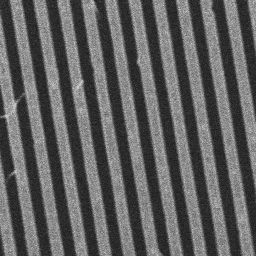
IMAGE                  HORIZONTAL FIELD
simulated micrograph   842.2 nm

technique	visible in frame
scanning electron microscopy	parallel lines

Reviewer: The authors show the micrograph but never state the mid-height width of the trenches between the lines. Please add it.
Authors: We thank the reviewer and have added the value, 40.9 nm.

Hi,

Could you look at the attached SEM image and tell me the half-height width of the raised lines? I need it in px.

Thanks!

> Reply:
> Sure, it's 10.6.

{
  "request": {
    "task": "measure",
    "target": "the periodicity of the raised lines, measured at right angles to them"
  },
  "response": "77.1 nanometres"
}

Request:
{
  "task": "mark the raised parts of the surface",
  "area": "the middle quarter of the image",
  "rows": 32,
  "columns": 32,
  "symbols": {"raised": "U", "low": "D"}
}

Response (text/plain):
DUUUDDDUUUDDDUUUDDDUUUDDDUUUDDDU
DDUUDDDDUUDDDUUUDDDUUUDDDUUUDDDU
DDUUDDDDUUDDDDUUDDDUUUDDDUUUDDDU
DDUUDDDDUUDDDDUUDDDDUUDDDUUUDDDU
DDUUUDDDUUUDDDUUDDDDUUDDDDUUDDDD
DDUUUDDDUUUDDDUUUDDDUUUDDDUUDDDD
DDUUUDDDUUUDDDUUUDDDUUUDDDUUUDDD
DDUUUDDDUUUDDDUUUDDDUUUDDDUUUDDD
DDUUUDDDUUUDDDDUUDDDUUUDDDUUUDDD
DDDUUDDDDUUDDDDUUDDDDUUDDDUUUDDD
DDDUUUDDDUUDDDDUUDDDDUUDDDDUUDDD
DDDUUUDDDUUUDDDUUUDDDUUUDDDUUDDD
DDDUUUDDDUUUDDDUUUDDDUUUDDDUUUDD
DDDUUUDDDUUUDDDUUUDDDUUUDDDUUUDD
DDDUUUDDDUUUDDDUUUDDDUUUDDDUUUDD
DDDDUUDDDDUUDDDDUUDDDDUUDDDDUUDD
UDDDUUUDDDUUUDDDUUDDDDUUDDDDUUDD
UDDDUUUDDDUUUDDDUUUDDDUUUDDDUUDD
UDDDUUUDDDUUUDDDUUUDDDUUUDDDUUUD
UDDDDUUDDDUUUDDDUUUDDDUUUDDDUUUD
UDDDDUUDDDUUUDDDUUUDDDUUUDDDUUUD
UUDDDUUDDDDUUDDDUUUDDDDUUDDDDUUD
UDDDDUUUDDDUUUDDDUUDDDDUUDDDDUUD
UUDDDUUUDDDUUUDDDUUUDDDUUDDDDUUD
UUDDDUUUDDDUUUDDDUUUDDDUUUDDDUUU
UUDDDUUUDDDUUUDDDUUUDDDUUUDDDUUU
UUDDDUUUDDDUUUDDDUUUDDDUUUDDDUUU
UUUDDDUUDDDDUUDDDUUUDDDDUUDDDUUU
UUUDDDUUUDDDUUDDDDUUDDDDUUDDDUUU
UUUDDDUUUDDDUUUDDDUUUDDDUUUDDDUU
UUUDDDUUUDDDUUUDDDUUUDDDUUUDDDUU
UUUDDDUUUDDDUUUDDDUUUDDDUUUDDDUU